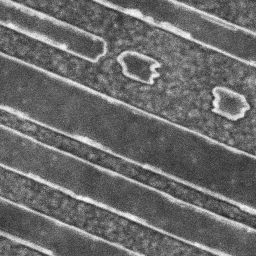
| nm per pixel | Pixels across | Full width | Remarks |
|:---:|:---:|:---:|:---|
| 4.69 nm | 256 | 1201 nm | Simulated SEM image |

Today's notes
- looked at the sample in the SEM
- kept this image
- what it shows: one or a few lines or trenches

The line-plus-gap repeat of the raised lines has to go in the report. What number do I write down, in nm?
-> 295